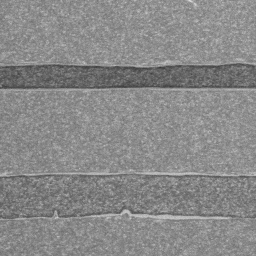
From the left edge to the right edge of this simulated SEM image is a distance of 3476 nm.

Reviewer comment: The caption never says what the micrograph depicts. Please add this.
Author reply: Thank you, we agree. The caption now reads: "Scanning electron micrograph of one or a few lines or trenches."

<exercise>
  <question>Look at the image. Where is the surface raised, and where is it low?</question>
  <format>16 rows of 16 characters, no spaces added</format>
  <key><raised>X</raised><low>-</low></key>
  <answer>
XXXXXXXXXXXXXXXX
XXXXXXXXXXXXXXXX
XXXXXXXXXXXXXXXX
XXXXXXXXXXXXXXXX
----------------
----------------
XXXXXXXXXXXXXXXX
XXXXXXXXXXXXXXXX
XXXXXXXXXXXXXXXX
XXXXXXXXXXXXXXXX
XXXXXXXXXXXXXXXX
----------------
----------------
------XXX-------
XXXXXXXXXXXXXXXX
XXXXXXXXXXXXXXXX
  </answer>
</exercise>